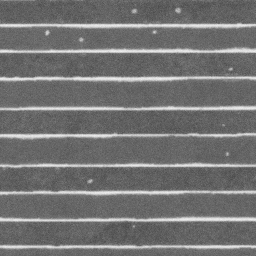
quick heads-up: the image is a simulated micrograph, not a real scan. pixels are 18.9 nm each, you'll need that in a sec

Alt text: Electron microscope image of lines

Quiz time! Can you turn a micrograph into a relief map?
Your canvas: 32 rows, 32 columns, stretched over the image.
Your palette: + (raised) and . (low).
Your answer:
................................
................................
................................
++++++++++++++++++++++++++++++++
++++++++++++++++++++++++++++++++
++++++++++++++++++++++++++++++++
................................
................................
................................
................................
++++++++++++++++++++++++++++++++
++++++++++++++++++++++++++++++++
++++++++++++++++++++++++++++++++
++++++++++++++++++++++++++++++++
................................
................................
................................
++++++++++++++++++++++++++++++++
++++++++++++++++++++++++++++++++
++++++++++++++++++++++++++++++++
++++++++++++++++++++++++++++++++
................................
................................
................................
++++++++++++++++++++++++++++++++
++++++++++++++++++++++++++++++++
++++++++++++++++++++++++++++++++
................................
................................
................................
................................
++++++++++++++++++++++++++++++++